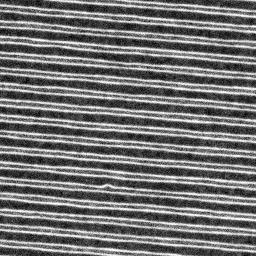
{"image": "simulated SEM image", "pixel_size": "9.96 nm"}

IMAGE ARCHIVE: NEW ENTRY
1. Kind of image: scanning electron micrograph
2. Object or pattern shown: parallel lines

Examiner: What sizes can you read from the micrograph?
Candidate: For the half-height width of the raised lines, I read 11.1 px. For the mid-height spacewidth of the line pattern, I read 43.4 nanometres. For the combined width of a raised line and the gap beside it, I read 0.155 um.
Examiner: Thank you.